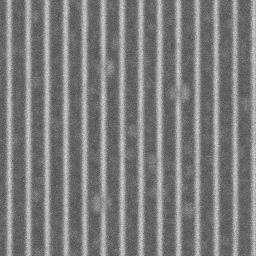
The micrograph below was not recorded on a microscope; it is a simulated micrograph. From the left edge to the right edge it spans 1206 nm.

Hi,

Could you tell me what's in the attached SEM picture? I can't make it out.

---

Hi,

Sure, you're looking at parallel lines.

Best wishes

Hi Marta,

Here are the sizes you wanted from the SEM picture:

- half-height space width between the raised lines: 0.0706 microns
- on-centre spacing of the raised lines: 88.5 nm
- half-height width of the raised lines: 17.7 nm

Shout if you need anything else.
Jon